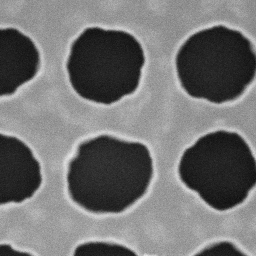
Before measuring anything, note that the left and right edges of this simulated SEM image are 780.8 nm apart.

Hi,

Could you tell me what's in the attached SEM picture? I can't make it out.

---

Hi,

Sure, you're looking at holes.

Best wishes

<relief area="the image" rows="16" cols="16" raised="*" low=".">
****************
****************
..***....***....
..**.....**.....
..**.....**.....
.****....**....*
****************
****************
.*****.******..*
..***....***....
..**......*.....
..**.....***....
..***....****..*
****************
****************
.****...*****..*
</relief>